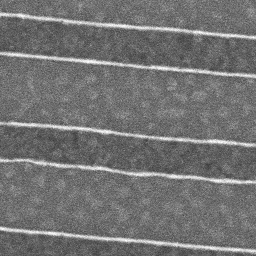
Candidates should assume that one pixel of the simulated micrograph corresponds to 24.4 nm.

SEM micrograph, one or a few lines or trenches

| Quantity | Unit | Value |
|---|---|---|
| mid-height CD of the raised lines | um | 0.93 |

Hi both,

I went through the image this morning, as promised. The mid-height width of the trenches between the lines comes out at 1670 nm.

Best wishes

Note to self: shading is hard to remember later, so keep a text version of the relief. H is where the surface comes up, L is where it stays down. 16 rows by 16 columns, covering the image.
LLLLLLLLLLLLLLLL
HHHHHHLLLLLLLLLL
HHHHHHHHHHHHHHHH
LLHHHHHHHHHHHHHH
LLLLLLLLLLLLLHHH
LLLLLLLLLLLLLLLL
LLLLLLLLLLLLLLLL
LLLLLLLLLLLLLLLL
HHHHHHHHHLLLLLLL
HHHHHHHHHHHHHHHH
LLLLLLHHHHHHHHHH
LLLLLLLLLLLLLLLL
LLLLLLLLLLLLLLLL
LLLLLLLLLLLLLLLL
HHLLLLLLLLLLLLLL
HHHHHHHHHHHHHLLL